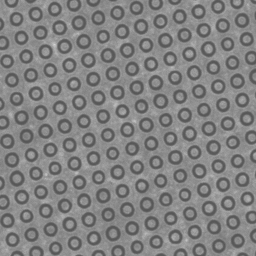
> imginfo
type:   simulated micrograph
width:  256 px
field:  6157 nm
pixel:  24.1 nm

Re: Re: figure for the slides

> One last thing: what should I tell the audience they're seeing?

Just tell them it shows a regular array of ring-shaped grooves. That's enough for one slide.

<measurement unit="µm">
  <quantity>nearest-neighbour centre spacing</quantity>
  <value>0.46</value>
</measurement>